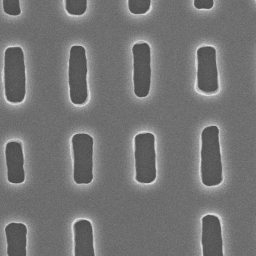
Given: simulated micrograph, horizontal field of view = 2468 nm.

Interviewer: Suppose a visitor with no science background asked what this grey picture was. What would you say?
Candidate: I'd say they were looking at a regular array of holes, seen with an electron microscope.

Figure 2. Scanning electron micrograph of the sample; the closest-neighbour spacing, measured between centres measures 0.615 micrometres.